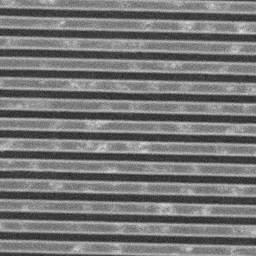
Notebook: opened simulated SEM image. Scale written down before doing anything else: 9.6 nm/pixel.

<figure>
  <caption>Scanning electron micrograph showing parallel lines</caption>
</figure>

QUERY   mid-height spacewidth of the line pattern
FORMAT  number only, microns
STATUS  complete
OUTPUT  0.0804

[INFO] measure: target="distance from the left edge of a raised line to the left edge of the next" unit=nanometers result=195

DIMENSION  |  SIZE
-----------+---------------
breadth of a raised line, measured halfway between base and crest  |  0.115 µm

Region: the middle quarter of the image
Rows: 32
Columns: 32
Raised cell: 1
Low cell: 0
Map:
11111111111111111111111111111111
11100101111111111111111111111111
00000000000000000000000000000000
00000000000000000000000000000000
11111111111111111111111111100000
11111111111111111111111111111111
11111111111111111111111111111111
00000000000000000000000000000000
00000000000000000000000000000000
11111111111111111111111000000000
11111111111111111111111111111111
11111111111111111111111111111111
00000000000000000000000000000000
00000000000000000000000000000000
11111111111111111110000001100000
11111111111111111111111111111111
11111111111111111111111111111111
00000000000000000000000000000111
00000000000000000000000000000000
11111111111111111100000000000000
11111111111111111111111111111111
11111111111111111111111111111111
00000000000000000000000000000000
00000000000000000000000000000000
11111111111111111110000000000000
11111111111111111111111111111111
11111111111111111111111111111111
00000000000000000000000000000111
00000000000000000000000000000000
11111111110000000000000000000000
11111111111111111111111111111111
11111111111111111111111111111111